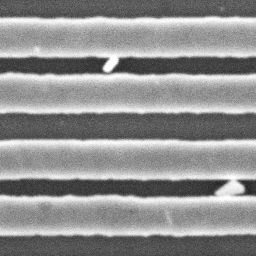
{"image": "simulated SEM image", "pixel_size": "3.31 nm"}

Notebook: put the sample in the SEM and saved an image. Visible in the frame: lines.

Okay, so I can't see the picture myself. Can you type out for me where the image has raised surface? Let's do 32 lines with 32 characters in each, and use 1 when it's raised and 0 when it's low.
00000000000000000000000000000000
00000000000000000000000000000000
11111111111111111111111111111111
11111111111111111111111111111111
11111111111111111111111111111111
11111111111111111111111111111111
11111111111111111111111111111111
00000000000000100000000000000000
00000000000001000000000000000000
11111111111111111111111111111111
11111111111111111111111111111111
11111111111111111111111111111111
11111111111111111111111111111111
11111111111111111111111111111111
00000000000000000000000000000000
00000000000000000000000000000000
00000000000000000000000000000000
00000000000000000000000000000000
11111111111111111111111111111111
11111111111111111111111111111111
11111111111111111111111111111111
11111111111111111111111111111111
00000000000000000000000000001100
00000000000000000000000000001100
10000000100011100000000000111110
11111111111111111111111111111111
11111111111111111111111111111111
11111111111111111111111111111111
11111111111111111111111111111111
00000000000000000000000000000000
00000000000000000000000000000000
00000000000000000000000000000000